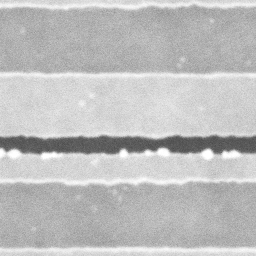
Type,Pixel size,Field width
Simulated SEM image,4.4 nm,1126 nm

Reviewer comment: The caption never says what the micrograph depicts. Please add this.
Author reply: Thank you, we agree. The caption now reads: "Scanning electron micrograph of lines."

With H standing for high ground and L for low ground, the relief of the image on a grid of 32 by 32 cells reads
HHHHHHHHHHHHHHHHHHLHHHHHLHHHHHHH
LLLLLLLLLLLLLLLLLLLLLLLLLLLLLLLL
LLLLLLLLLLLLLLLLLLLLLLLLLLLLLLLL
LLLLLLLLLLLLLLLLLLLLLLLLLLLLLLLL
LLLLLLLLLLLLLLLLLLLLLLLLLLLLLLLL
LLLLLLLLLLLLLLLLLLLLLLLLLLLLLLLL
LLLLLLLLLLLLLLLLLLLLLLLLLLLLLLLL
LLLLLLLLLLLLLLLLLLLLLLLLLLLLLLLL
LLLLLLLLLLLLLLLLLLLLLLLLLLLLLLLL
HHHHHHHHHHHHHHHHHHHHHHHHHLHHHHHH
HHHHHHHHHHHHHHHHHHHHHHHHHHHHHHHH
HHHHHHHHHHHHHHHHHHHHHHHHHHHHHHHH
HHHHHHHHHHHHHHHHHHHHHHHHHHHHHHHH
HHHHHHHHHHHHHHHHHHHHHHHHHHHHHHHH
HHHHHHHHHHHHHHHHHHHHHHHHHHHHHHHH
HHHHHHHHHHHHHHHHHHHHHHHHHHHHHHHH
HHHHHHHHHHHHHHHHHHHHHHHHHHHHHHHH
LLLLLLLLLLLLLLLLLLLLLLLLLLLLLLLL
LLLLLLLLLLLLLLLLLLLLLLLLLLLLLLLL
HHHHHHHHHHHHHHHHHHHHHHHHHHHHHHHH
HHHHHHHHHHHHHHHHHHHHHHHHHHHHHHHH
HHHHHHHHHHHHHHHHHHHHHHHHHHHHHHHH
HHHHHHHHHHHHHHHHHHHHHHHHLHHHHHHH
LLLLLLLLLLLLLLLLLLLLLLLLLLLLLLLL
LLLLLLLLLLLLLLLLLLLLLLLLLLLLLLLL
LLLLLLLLLLLLLLLLLLLLLLLLLLLLLLLL
LLLLLLLLLLLLLLLLLLLLLLLLLLLLLLLL
LLLLLLLLLLLLLLLLLLLLLLLLLLLLLLLL
LLLLLLLLLLLLLLLLLLLLLLLLLLLLLLLL
LLLLLLLLLLLLLLLLLLLLLLLLLLLLLLLL
LLLLLLLLLLLLLLLLLLLLLLLLLLLLLLLL
HHHHHHHHHHHHHHHHHHHHHHHHHHHHHHHH